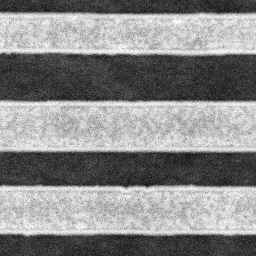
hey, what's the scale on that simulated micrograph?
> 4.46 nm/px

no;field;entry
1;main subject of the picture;one or a few lines or trenches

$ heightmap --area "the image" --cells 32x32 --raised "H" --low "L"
LLLLLLLLLLLLLLLLLLLLLLLLLLLLLLLL
LLLLLLLLLLLLLLLLLLLLLLLLLLLLLLLL
HHHHHHHHHHHHHHHHHHHHHHHHHHHHHHHH
HHHHHHHHHHHHHHHHHHHHHHHHHHHHHHHH
HHHHHHHHHHHHHHHHHHHHHHHHHHHHHHHH
HHHHHHHHHHHHHHHHHHHHHHHHHHHHHHHH
LLLLLLLLLLLLLLLLLLLLLLLLLLLLLLLL
LLLLLLLLLLLLLLLLLLLLLLLLLLLLLLLL
LLLLLLLLLLLLLLLLLLLLLLLLLLLLLLLL
LLLLLLLLLLLLLLLLLLLLLLLLLLLLLLLL
LLLLLLLLLLLLLLLLLLLLLLLLLLLLLLLL
LLLLLLLLLLLLLLLLLLLLLLLLLLLLLLLL
LLLLLLLLLLLLLLLLLLLLLLLLLLLLLLLL
HHHHHHHHHHHHHHHHHHHHHHHHHHHHHHHH
HHHHHHHHHHHHHHHHHHHHHHHHHHHHHHHH
HHHHHHHHHHHHHHHHHHHHHHHHHHHHHHHH
HHHHHHHHHHHHHHHHHHHHHHHHHHHHHHHH
HHHHHHHHHHHHHHHHHHHHHHHHHHHHHHHH
LHHHHHHHHHHHHHLHHHLLLLHHHHHHHHHH
LLLLLLLLLLLLLLLLLLLLLLLLLLLLLLLL
LLLLLLLLLLLLLLLLLLLLLLLLLLLLLLLL
LLLLLLLLLLLLLLLLLLLLLLLLLLLLLLLL
LLLLLLLLLLLLLLLLLLLLLLLLLLLLLLLL
LLLLLLLLLLLLLLLLLLLLLLLLLLLLLLLL
HHHHHHHHHHHHHHHHHHHHHHHHHHHHHHHH
HHHHHHHHHHHHHHHHHHHHHHHHHHHHHHHH
HHHHHHHHHHHHHHHHHHHHHHHHHHHHHHHH
HHHHHHHHHHHHHHHHHHHHHHHHHHHHHHHH
HHHHHHHHHHHHHHHHHHHHHHHHHHHHHHHH
LLLLLLLLLLLLLLLLLLLLLLLLLLLLLLLL
LLLLLLLLLLLLLLLLLLLLLLLLLLLLLLLL
LLLLLLLLLLLLLLLLLLLLLLLLLLLLLLLL